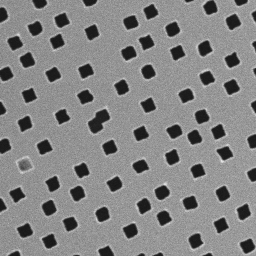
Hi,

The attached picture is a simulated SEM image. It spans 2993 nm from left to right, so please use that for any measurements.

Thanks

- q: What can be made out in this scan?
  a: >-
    a regular array of holes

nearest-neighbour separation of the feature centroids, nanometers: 308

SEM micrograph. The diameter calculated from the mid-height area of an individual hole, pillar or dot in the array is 167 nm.